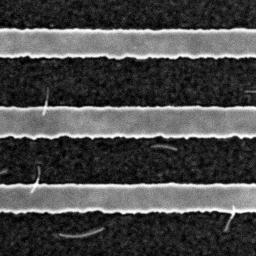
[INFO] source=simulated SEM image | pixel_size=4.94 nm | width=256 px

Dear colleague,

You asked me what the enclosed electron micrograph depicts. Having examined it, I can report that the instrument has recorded lines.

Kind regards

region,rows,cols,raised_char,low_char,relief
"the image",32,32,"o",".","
................................
................................
................................
................................
oooooooooooooooooooooooooooooooo
oooooooooooooooooooooooooooooooo
oooooooooooooooooooooooooooooooo
................................
................................
................................
................................
................................
................................
oooooooooooooooooooooooooooooooo
oooooooooooooooooooooooooooooooo
oooooooooooooooooooooooooooooooo
oooooooooooooooooooooooooooooooo
................................
................................
................................
................................
................................
................................
oooooooooooooooooooooooooooooooo
oooooooooooooooooooooooooooooooo
oooooooooooooooooooooooooooooooo
.ooo.ooo.....oooooo..oo.....ooo.
................................
................................
................................
................................
................................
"